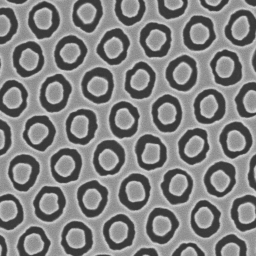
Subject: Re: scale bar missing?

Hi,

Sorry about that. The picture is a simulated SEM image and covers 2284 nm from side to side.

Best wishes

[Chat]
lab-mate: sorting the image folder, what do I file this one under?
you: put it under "a regular array of ring-shaped grooves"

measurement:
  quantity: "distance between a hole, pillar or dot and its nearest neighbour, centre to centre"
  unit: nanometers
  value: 370